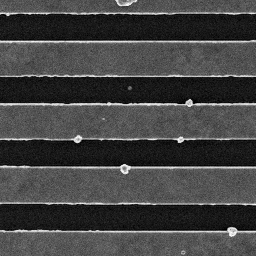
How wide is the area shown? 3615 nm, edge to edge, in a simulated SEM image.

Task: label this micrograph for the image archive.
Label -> lines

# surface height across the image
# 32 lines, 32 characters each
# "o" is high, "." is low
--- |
oooooooooooooooooooooooooooooooo
oooooooooooooooooooooooooooooooo
................................
................................
................................
oooooooooooooooooooooooooooooooo
oooooooooooooooooooooooooooooooo
oooooooooooooooooooooooooooooooo
oooooooooooooooooooooooooooooooo
oooooooooooooooooooooooooooooooo
................................
................................
................................
oooooooooooooooooooooooooooooooo
oooooooooooooooooooooooooooooooo
oooooooooooooooooooooooooooooooo
oooooooooooooooooooooooooooooooo
.........o............o.........
................................
................................
................................
oooooooooooooooooooooooooooooooo
oooooooooooooooooooooooooooooooo
oooooooooooooooooooooooooooooooo
oooooooooooooooooooooooooooooooo
...................o.....oo.o.oo
................................
................................
................................
oooooooooooooooooooooooooooooooo
oooooooooooooooooooooooooooooooo
oooooooooooooooooooooooooooooooo